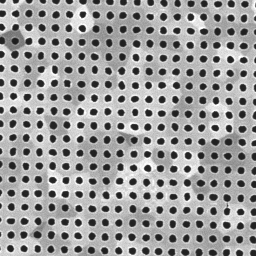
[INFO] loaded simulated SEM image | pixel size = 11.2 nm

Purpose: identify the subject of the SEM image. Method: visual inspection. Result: a regular array of holes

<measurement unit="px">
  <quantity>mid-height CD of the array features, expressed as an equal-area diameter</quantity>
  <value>7.49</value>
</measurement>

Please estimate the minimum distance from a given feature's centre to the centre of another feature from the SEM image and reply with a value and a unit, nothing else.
147 nm